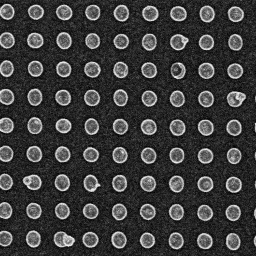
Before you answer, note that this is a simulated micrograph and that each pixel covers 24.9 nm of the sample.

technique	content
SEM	a regular array of raised bodies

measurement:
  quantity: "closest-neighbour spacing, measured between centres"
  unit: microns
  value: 0.701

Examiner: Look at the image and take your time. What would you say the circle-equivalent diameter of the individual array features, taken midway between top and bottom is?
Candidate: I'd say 0.373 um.